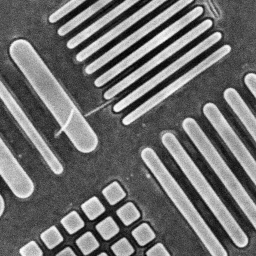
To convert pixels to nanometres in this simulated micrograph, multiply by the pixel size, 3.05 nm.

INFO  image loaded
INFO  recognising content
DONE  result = groups of lines, slits or small figures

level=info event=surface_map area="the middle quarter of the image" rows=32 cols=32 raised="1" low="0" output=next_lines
00000011110001110000111000111100
00000111000111100011100001110001
00000000001110000111000111100011
00000000111100011110001111000111
00000000111000111000011100011110
00000000100001110001111000111100
00000000000111100011100011110000
10000000001110000111000111100000
10000000001100011110001111000000
11000000000000111000011100000000
11100000000001110001110000000000
11110000000001000011100000000000
11110000000000001111000000000000
11111000000000011100000000000000
11111100000000011000000000000011
11111100000000000000000000000011
11111110000000000000000000000011
01111111000000000000000001100001
01111111000000000000000001110001
00111111000000000000000001111000
00011111000000000000000001111000
00001110000000000000110000111100
00000000000000000001111000011110
00000000000000000000111100011110
00000000000000000000111100001111
00000000000000000000011110000111
00000000000000000000001111000011
00000000000000000000001111000011
00000000000000000000000111100001
00000000000010000000000011110000
00000000000111000000000001111000
00000000001111100000000001111100